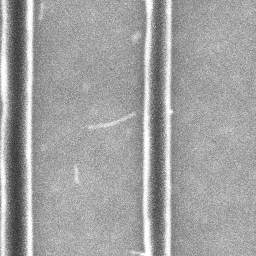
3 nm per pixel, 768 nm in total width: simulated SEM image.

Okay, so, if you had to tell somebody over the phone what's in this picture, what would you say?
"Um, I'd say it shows one or a few lines or trenches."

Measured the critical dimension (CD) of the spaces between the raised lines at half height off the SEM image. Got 114 pixels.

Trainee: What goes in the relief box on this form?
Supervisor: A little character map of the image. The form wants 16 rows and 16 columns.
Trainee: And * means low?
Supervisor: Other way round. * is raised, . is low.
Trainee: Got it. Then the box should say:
**.......**.....
**.......**.....
**.......**.....
**.......**.....
**.......**.....
**.......**.....
**.......**.....
**.......**.....
**.......**.....
**.......**.....
**.......**.....
**.......**.....
**.......**.....
**.......**.....
**.......**.....
**.......**.....